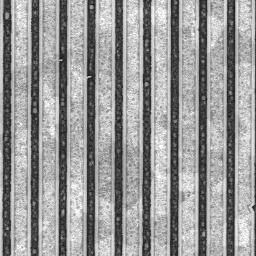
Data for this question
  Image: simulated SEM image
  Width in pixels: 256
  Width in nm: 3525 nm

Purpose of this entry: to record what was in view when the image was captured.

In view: parallel lines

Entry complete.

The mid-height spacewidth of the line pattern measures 0.141 um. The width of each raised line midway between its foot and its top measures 236 nm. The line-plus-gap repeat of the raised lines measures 385 nm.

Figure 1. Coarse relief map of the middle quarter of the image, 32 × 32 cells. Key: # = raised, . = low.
.####...####...####...####...###
.####...####...####...####...###
.####...####...####...####...###
.#####..####...####...####...###
.####...####...####...####...###
.####...####...####...####...###
.####...####...####...####...###
.####...####...####...####...###
.####...####...####...####...###
.####...####...####...####...###
.####...####...####...####...###
.####...####...####...####...###
.####...####...####...####...###
.####...####...####...####...###
.####...####...####...####...###
.####...####...####...####...###
.####...####...####...####...###
.####...####...####...####...###
.####...####...####...####...###
.####...####...####...####...###
.####...####...####...####...###
.####...####...####...####...###
.####...####...####...####...###
.####...####...####...####...###
.####...####...####...####...###
.####...####...####...####...###
.####...####...####...####...###
.####...####...####...####...###
.####...####...####...####...###
.####...####...####...####...###
.####...####...####...####...###
.####...####...####...####...###